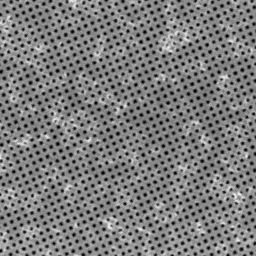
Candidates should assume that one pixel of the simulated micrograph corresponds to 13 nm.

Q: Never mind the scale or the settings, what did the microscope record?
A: a regular array of holes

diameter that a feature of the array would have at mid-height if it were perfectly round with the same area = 0.0508 um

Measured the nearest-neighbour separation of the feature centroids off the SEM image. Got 91.8 nm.